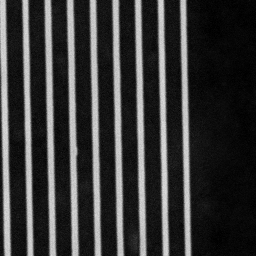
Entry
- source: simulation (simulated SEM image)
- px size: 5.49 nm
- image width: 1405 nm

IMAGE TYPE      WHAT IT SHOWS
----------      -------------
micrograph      parallel lines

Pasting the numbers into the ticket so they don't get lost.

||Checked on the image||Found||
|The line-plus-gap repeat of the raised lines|124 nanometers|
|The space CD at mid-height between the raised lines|92.6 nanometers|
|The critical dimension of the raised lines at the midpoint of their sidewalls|5.37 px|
